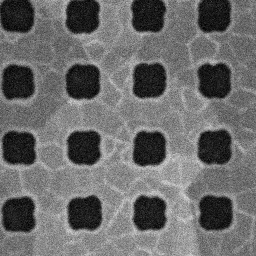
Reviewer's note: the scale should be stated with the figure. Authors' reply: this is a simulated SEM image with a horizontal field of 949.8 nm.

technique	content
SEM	a regular array of holes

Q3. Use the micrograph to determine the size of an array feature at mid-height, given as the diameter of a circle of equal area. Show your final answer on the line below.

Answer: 144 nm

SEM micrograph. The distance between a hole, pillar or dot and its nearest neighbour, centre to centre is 242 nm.